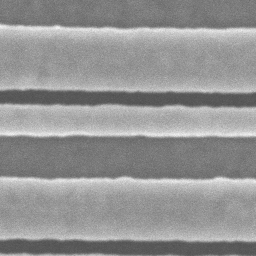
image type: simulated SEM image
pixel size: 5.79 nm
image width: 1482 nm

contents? lines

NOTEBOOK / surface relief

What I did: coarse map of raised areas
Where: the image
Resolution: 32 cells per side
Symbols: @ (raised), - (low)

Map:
--------------------------------
--------------------------------
--------------------------------
@@@@@@@@------------------------
@@@@@@@@@@@@@@@@@@@@@@@@@@@@@@@@
@@@@@@@@@@@@@@@@@@@@@@@@@@@@@@@@
@@@@@@@@@@@@@@@@@@@@@@@@@@@@@@@@
@@@@@@@@@@@@@@@@@@@@@@@@@@@@@@@@
@@@@@@@@@@@@@@@@@@@@@@@@@@@@@@@@
@@@@@@@@@@@@@@@@@@@@@@@@@@@@@@@@
@@@@@@@@@@@@@@@@@@@@@@@@@@@@@@@@
-------------------------@@@@@@@
--------------------------------
@@@@@@@@@@@@@@@@@@@@@@@@-@------
@@@@@@@@@@@@@@@@@@@@@@@@@@@@@@@@
@@@@@@@@@@@@@@@@@@@@@@@@@@@@@@@@
@@@@@@@@@@@@@@@@@@@@@@@@@@@@@@@@
--------------------------------
--------------------------------
--------------------------------
--------------------------------
--------------------------------
@@@@@--@@@@@@@@@@----------@@-@@
@@@@@@@@@@@@@@@@@@@@@@@@@@@@@@@@
@@@@@@@@@@@@@@@@@@@@@@@@@@@@@@@@
@@@@@@@@@@@@@@@@@@@@@@@@@@@@@@@@
@@@@@@@@@@@@@@@@@@@@@@@@@@@@@@@@
@@@@@@@@@@@@@@@@@@@@@@@@@@@@@@@@
@@@@@@@@@@@@@@@@@@@@@@@@@@@@@@@@
@@@@@@@@@@@@@@@@@@@@@@@@@@@@@@@@
--------------------------------
--------------------------------